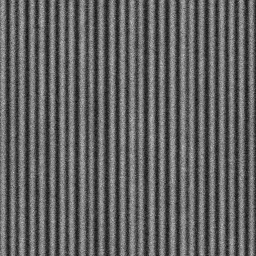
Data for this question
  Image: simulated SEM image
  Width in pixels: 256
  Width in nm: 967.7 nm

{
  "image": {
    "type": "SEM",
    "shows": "parallel lines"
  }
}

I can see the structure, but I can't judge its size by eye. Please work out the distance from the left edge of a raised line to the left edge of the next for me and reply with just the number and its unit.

0.0375 micrometres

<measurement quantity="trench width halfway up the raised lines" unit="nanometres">13.7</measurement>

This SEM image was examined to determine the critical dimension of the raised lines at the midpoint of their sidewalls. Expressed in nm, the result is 23.1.